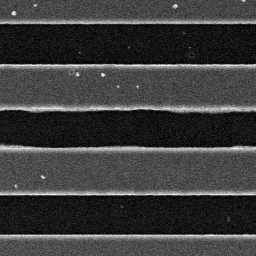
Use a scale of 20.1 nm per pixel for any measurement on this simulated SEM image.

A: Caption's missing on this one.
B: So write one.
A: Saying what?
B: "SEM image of lines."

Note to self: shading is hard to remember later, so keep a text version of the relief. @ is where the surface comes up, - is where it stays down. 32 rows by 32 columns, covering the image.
@@@@@@@@@@@@@@@@@@@@@@@@@@@@@@@@
@@@@@@@@@@@@@@@@@@@@@@@@@@@@@@@@
@@@@@@@@@@@@@@@@@@@@@@@@@@@@@@@@
--------------------------------
--------------------------------
--------------------------------
--------------------------------
--------------------------------
@@@@@@@@@@@@@@@@@@@@@@@@@@@@@@@@
@@@@@@@@@@@@@@@@@@@@@@@@@@@@@@@@
@@@@@@@@@@@@@@@@@@@@@@@@@@@@@@@@
@@@@@@@@@@@@@@@@@@@@@@@@@@@@@@@@
@@@@@@@@@@@@@@@@@@@@@@@@@@@@@@@@
@@@@@@@@@@@@@@@@@-@@@@@@@@@@@@@@
--------------------------------
--------------------------------
--------------------------------
--------------------------------
--------------------------------
@@@@@@@@@@@@@@@@@@@@@@@@@@@@@@@@
@@@@@@@@@@@@@@@@@@@@@@@@@@@@@@@@
@@@@@@@@@@@@@@@@@@@@@@@@@@@@@@@@
@@@@@@@@@@@@@@@@@@@@@@@@@@@@@@@@
@@@@@@@@@@@@@@@@@@@@@@@@@@@@@@@@
--------------------------------
--------------------------------
--------------------------------
--------------------------------
--------------------------------
@@@@@@@@@@@@@@@@@@@@@@@@@@@@@@@@
@@@@@@@@@@@@@@@@@@@@@@@@@@@@@@@@
@@@@@@@@@@@@@@@@@@@@@@@@@@@@@@@@